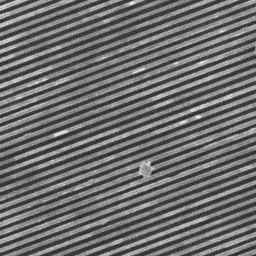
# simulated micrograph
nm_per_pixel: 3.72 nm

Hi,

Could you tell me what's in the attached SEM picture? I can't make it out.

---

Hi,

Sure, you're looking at parallel lines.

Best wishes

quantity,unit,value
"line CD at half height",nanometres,12.2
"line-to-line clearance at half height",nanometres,17.9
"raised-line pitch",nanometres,30.2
